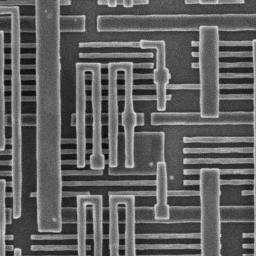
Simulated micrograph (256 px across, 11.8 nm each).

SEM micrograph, wiring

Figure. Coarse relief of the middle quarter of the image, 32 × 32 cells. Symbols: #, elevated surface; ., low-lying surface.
...######..######......##.......
...######..###.##......###......
...##..##..##..##......###......
...##..##..##..##......###......
...##..##..##..##......###......
...##..##..##..##......##.......
...##..##..##..##......##.......
...##..##..##..##......##.......
...##..##..##..##......##.......
...##..##..##..##.......#.......
...##..##..##..##.......#.......
...##..##..##..##...............
...##..##..##..###..............
...##..##..##..###..............
...##..##..##..###..............
...##..##..##..###..............
...##..##..##..##...............
...##..##..##..##...............
...##..##..##..##...............
...##..##..##..##...............
...##..##..##..##...............
...##..##..##..##...............
...##..##..##..##...............
...##..###.##..##...............
...##..###.##..##...............
...##..###.##..##.......#.......
.......................##.......
.......................###......
.......................###......
.......................###......
.......................###......
.......................###......